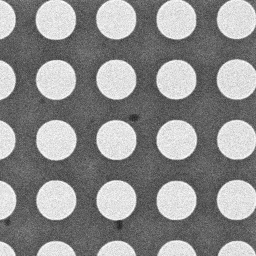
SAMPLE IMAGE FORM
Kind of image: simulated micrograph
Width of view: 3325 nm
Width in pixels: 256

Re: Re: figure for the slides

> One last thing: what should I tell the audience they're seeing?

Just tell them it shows an array of small figures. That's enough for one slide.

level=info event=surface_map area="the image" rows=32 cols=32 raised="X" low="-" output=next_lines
X-----XX-----XXX-----XX-----XXX-
XX---XXXX---XXXXX---XXXX---XXXXX
XX--XXXXX---XXXXX---XXXX---XXXXX
XX---XXXX---XXXXX---XXXX---XXXXX
X-----XX-----XXX-----XX-----XXX-
--------------------------------
--------------------------------
-----------------------------X--
X----XXXX----XXX----XXXX----XXXX
XX---XXXX---XXXXX---XXXX---XXXXX
XX---XXXX---XXXXX---XXXX---XXXXX
X----XXXX----XXX----XXXX----XXXX
--------------------------------
--------------------------------
--------------------------------
X-----XX-----XXX-----XXX----XXX-
XX---XXXX---XXXXX---XXXX---XXXXX
XX---XXXXX--XXXXX---XXXXX--XXXXX
XX---XXXX---XXXXX---XXXX---XXXXX
X-----XXX----XXX-----XXX----XXX-
--------------------------------
--------------------------------
--------------------------------
X----XXXX----XXX----XXXX----XXXX
XX---XXXX---XXXXX---XXXX---XXXXX
XX---XXXX---XXXXX---XXXX---XXXXX
X----XXXX----XXX----XXXX----XXXX
--------------X-----------------
--------------------------------
--------------------------------
X-----XX-----XXX-----XX-----XXX-
XX---XXXX---XXXXX---XXXX---XXXXX